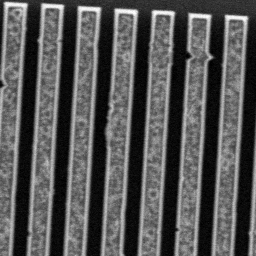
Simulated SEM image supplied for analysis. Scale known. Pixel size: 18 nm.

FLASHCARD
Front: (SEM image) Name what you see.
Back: parallel lines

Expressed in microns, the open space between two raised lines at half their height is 0.305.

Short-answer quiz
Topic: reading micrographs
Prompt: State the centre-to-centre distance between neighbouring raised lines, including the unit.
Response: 0.662 µm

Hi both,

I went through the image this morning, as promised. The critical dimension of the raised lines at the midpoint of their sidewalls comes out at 359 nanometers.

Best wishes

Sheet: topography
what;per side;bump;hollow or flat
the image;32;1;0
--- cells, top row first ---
00000000000000000000000000000000
01100111001100011000000000000000
01100111001100111001110011001110
01100111001100111001110011001110
11100111001100111001100011001110
11100110001100111001100011001110
11100110001100111001100011001100
11100110001100111001100011001100
11100110011100111001100111001100
11100110011100111001100111001100
11100110011100111001100111001100
11000110011100110001100111001100
11000110011100110011100110001100
11000110011100110011100110001100
11001110011100110011100110001100
11001110011000110011100110001100
11001110011001110011100110011100
11001110011001110011100110011100
11001110011000110011100110011100
11001110011000110011000110011100
11001110011001110011000110011100
11001110011001110011000110011100
11001110011001110011000110011100
11001110011001110011001110011000
11001100011001110011001110011000
11001100111001100011001110011000
11001100111001100011001110011000
11001100111001100011001110011000
10001100111001100011001110011001
10001100111001100111001110011001
10001100111001100111001110011001
10011100111001100111001100011001